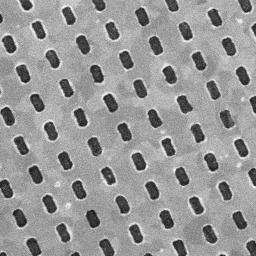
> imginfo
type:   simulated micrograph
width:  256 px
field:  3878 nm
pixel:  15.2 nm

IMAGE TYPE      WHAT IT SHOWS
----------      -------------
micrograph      a regular array of holes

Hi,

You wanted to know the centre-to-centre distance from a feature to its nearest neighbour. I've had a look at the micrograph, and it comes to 32.1 px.